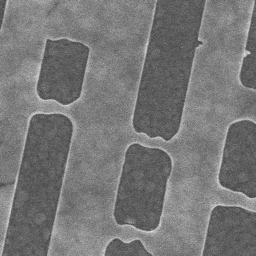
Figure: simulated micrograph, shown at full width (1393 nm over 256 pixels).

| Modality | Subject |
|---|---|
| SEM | one or a few lines or trenches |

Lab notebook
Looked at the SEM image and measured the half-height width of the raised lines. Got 303 nm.